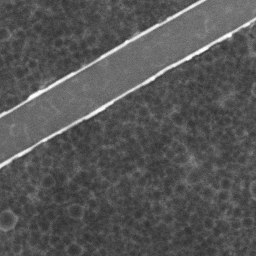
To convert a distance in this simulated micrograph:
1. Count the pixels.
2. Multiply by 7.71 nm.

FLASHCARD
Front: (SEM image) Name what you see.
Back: one or a few lines or trenches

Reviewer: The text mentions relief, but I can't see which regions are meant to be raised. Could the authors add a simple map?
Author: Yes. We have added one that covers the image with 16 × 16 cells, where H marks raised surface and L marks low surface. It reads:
HHHHHHHHHHHHLLLL
HHHHHHHHHHLLLLLH
HHHHHHHHLLLLLLHH
HHHHHHHLLLLLHHHH
HHHHHLLLLLHHHHHH
HHHLLLLLLHHHHHHH
HLLLLLLHHHHHHHHH
LLLLLHHHHHHHHHHH
LLLHHHHHHHHHHHHH
LHHHHHHHHHHHHHHH
HHHHHHHHHHHHHHHH
HHHHHHHHHHHHHHHH
HHHHHHHHHHHHHHHH
HHHHHHHHHHHHHHHH
HHHHHHHHHHHHHHHH
HHHHHHHHHHHHHHHH